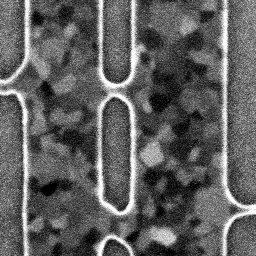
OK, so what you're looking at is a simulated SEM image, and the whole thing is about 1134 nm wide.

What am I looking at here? one or a few lines or trenches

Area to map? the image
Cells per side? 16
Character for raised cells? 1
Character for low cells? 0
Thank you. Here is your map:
0011110011111100
0011110011111100
0011110011111100
0011110011111100
0111110011111100
1111111111111100
0111111011111100
0111110011111100
0011110011111100
0011110011111100
0011110011111100
0011110011111100
0011110011111110
0011111111111110
0011111111111100
0011110011111100